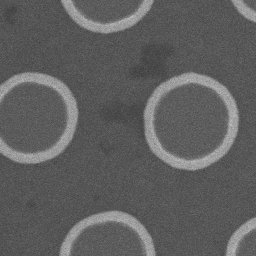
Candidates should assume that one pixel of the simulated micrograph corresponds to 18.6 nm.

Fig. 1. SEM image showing raised bodies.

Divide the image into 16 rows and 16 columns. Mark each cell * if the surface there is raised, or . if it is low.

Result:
....*****......*
.....***........
................
................
................
****......****..
****......****..
****.....******.
****.....*****..
***.......****..
................
................
................
................
.....****......*
....*****.....**